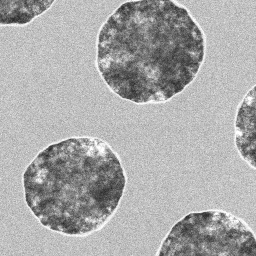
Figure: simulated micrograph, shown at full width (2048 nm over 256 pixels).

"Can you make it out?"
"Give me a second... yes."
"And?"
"holes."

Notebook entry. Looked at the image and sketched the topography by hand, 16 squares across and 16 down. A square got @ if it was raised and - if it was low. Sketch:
---@@@@----@@@@@
-@@@@@@-----@@@@
@@@@@@-------@@@
@@@@@@-------@@@
@@@@@@------@@@@
@@@@@@@----@@@@@
@@@@@@@@@@@@@@@-
@@@@@@@@@@@@@@@-
@@@@@@@@@@@@@@@-
@@@----@@@@@@@@-
@@------@@@@@@@@
@@------@@@@@@@@
@@-----@@@@@@@@@
@@-----@@@@@---@
@@@@--@@@@@-----
@@@@@@@@@@------